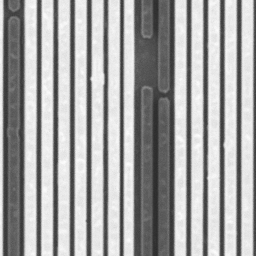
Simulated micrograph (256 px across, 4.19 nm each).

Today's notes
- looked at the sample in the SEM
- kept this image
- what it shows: parallel lines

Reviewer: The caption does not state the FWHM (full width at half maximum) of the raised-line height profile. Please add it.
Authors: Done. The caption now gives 45.6 nm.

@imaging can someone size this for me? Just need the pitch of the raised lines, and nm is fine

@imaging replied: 70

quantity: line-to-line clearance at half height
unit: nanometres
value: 23.1